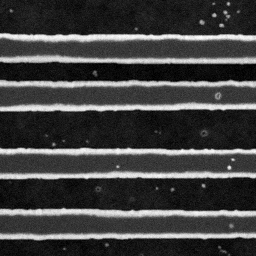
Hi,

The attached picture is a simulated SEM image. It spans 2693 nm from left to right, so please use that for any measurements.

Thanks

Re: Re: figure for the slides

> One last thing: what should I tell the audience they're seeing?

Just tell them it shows lines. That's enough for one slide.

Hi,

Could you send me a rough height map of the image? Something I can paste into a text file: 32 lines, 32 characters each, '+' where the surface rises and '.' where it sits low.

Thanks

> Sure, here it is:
................................
................................
................................
................................
++..............................
++++++++++++++++++++++++++++++++
++++++++++++++++++++++++++++++++
++++++++++++++++++++++++++++++++
................................
................................
++++++++++++++++++++++++++++++++
++++++++++++++++++++++++++++++++
++++++++++++++++++++++++++++++++
+++++++++++++++++++++++.........
................................
................................
................................
................................
................................
++++++++++++++++++++++++++++++++
++++++++++++++++++++++++++++++++
++++++++++++++++++++++++++++++++
................................
................................
................................
................................
++++++++++++++....+..++....+....
++++++++++++++++++++++++++++++++
++++++++++++++++++++++++++++++++
++++++++++++++++++++++++++++++++
................................
................................